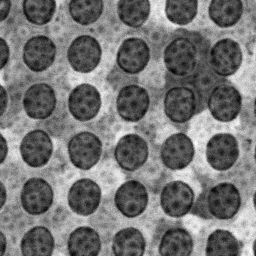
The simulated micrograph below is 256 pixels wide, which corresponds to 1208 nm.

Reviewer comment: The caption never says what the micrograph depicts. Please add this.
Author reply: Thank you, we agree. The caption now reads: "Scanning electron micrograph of a regular array of holes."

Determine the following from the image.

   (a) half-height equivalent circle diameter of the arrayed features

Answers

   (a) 161 nm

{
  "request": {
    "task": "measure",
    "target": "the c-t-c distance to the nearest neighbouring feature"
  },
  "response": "214 nm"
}